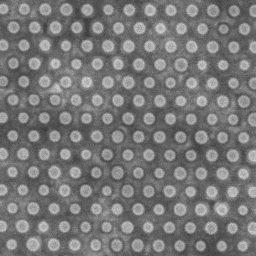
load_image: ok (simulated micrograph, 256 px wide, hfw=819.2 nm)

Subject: a regular array of raised bodies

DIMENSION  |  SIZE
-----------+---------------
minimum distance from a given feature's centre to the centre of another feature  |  66.2 nm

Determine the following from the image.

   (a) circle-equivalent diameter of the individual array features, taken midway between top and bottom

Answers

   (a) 33.3 nm